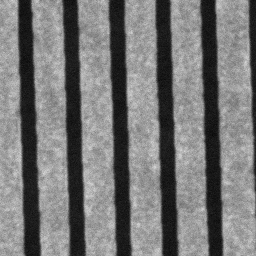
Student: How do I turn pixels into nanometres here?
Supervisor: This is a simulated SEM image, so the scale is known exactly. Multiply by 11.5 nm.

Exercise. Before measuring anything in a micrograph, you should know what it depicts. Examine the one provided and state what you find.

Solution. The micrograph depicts lines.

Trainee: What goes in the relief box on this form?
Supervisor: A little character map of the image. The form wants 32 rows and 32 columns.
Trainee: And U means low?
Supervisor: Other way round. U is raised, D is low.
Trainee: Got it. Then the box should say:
UUDDUUUUDDUUUDDDUUUDDUUUUDDUUUUD
UUDDUUUUDDUUUDDDUUUDDUUUUDDUUUUD
UUDDUUUUDDUUUUDDUUUDDUUUUDDUUUUD
UUDDUUUUDDUUUUDDUUUDDUUUUDDUUUUD
UUDDUUUUDDUUUUDDUUUDDDUUUDDUUUUD
UUDDUUUUDDUUUUDDUUUDDDUUUDDUUUUD
UUDDUUUUDDUUUUDDUUUDDDUUUDDUUUUD
UUDDUUUUDDUUUUDDUUUDDDUUUDDUUUUD
UUDDUUUUDDUUUUDDUUUDDDUUUDDUUUUD
UUDDUUUUDDUUUUDDUUUDDDUUUDDUUUUD
UUDDUUUUDDUUUUDDUUUUDDUUUDDUUUUD
UUDDDUUUDDUUUUDDUUUUDDUUUDDUUUUD
UUDDDUUUDDUUUUDDUUUUDDUUUDDUUUUD
UUDDDUUUDDUUUUDDUUUUDDUUUDDUUUUD
UUUDDUUUDDUUUUDDUUUUDDUUUDDDUUUD
UUUDDUUUDDUUUUDDUUUUDDUUUDDDUUUD
UUUDDUUUDDUUUUDDUUUUDDUUUDDDUUUD
UUUDDUUUDDUUUUDDUUUUDDUUUUDDUUUU
UUUDDUUUDDUUUUDDUUUUDDUUUUDDUUUU
UUUDDUUUDDUUUUDDUUUUDDUUUUDDUUUU
UUUDDUUUDDUUUUDDUUUUDDUUUUDDUUUU
UUUDDUUUDDUUUUDDUUUUDDUUUUDDUUUU
UUUDDUUUDDUUUUDDUUUUDDUUUUDDUUUU
UUUDDUUUDDDUUUDDUUUUDDUUUUDDUUUU
UUUDDUUUDDDUUUDDUUUUDDUUUUDDUUUU
UUUDDUUUDDDUUUDDUUUUDDUUUUDDUUUU
UUUDDUUUDDDUUUDDUUUUDDUUUUDDUUUU
UUUDDUUUDDDUUUDDUUUUDDUUUUDDUUUU
UUUDDUUUUDDUUUDDUUUUDDUUUUDDUUUU
UUUDDUUUUDDUUUDDUUUUDDUUUUDDUUUU
UUUDDUUUUDDUUUDDDUUUDDUUUUDDUUUU
UUUDDUUUUDDUUUDDDUUUDDUUUUDDUUUU